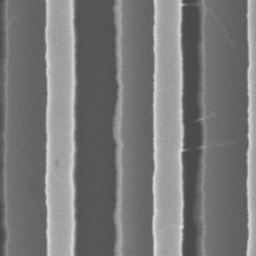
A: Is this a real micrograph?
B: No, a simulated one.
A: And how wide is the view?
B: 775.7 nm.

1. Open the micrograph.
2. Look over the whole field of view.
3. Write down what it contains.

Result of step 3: lines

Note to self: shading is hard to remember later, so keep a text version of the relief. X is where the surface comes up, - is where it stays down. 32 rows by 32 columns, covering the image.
-XXXXXXXX------XXXXXXXX--XXXXXXX
-XXXXXXXX------XXXXXXXX--XXXXXXX
-XXXXXXXX------XXXXXXXX--XXXXXXX
-XXXXXXXX------XXXXXXXX--XXXXXXX
-XXXXXXXX------XXXXXXXX--XXXXXXX
-XXXXXXXX------XXXXXXXX--XXXXXXX
-XXXXXXXX------XXXXXXXX--XXXXXXX
-XXXXXXXX------XXXXXXXX--XXXXXXX
XXXXXXXXX------XXXXXXXX--XXXXXXX
-XXXXXXXX------XXXXXXXX--XXXXXXX
XXXXXXXXX------XXXXXXXX--XXXXXXX
XXXXXXXXX------XXXXXXXX--XXXXXXX
-XXXXXXXX------XXXXXXXX--XXXXXXX
-XXXXXXXX------XXXXXXXX--XXXXXXX
-XXXXXXXX------XXXXXXXX--XXXXXXX
-XXXXXXXX------XXXXXXXX--XXXXXXX
XXXXXXXXX------XXXXXXXX--XXXXXXX
XXXXXXXXX------XXXXXXXX--XXXXXXX
XXXXXXXXX------XXXXXXXX--XXXXXXX
XXXXXXXXX------XXXXXXXX--XXXXXXX
XXXXXXXXX------XXXXXXXX--XXXXXXX
XXXXXXXXX------XXXXXXXX--XXXXXXX
XXXXXXXXX------XXXXXXXX--XXXXXXX
XXXXXXXXX------XXXXXXXX--XXXXXXX
XXXXXXXXX------XXXXXXXX--XXXXXXX
-XXXXXXXX------XXXXXXXX--XXXXXXX
-XXXXXXXX------XXXXXXXX--XXXXXXX
-XXXXXXXX------XXXXXXXX--XXXXXXX
-XXXXXXXX------XXXXXXXX--XXXXXXX
-XXXXXXXX------XXXXXXXX--XXXXXXX
-XXXXXXXX------XXXXXXXX--XXXXXXX
-XXXXXXXX------XXXXXXXX--XXXXXXX